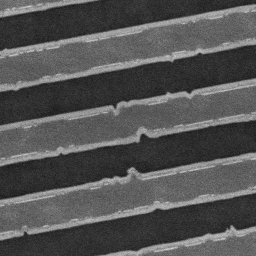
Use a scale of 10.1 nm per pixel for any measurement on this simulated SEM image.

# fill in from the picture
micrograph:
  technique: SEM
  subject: one or a few lines or trenches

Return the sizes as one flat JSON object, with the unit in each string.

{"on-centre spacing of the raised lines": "738 nanometres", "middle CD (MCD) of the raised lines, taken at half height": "357 nm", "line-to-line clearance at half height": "384 nm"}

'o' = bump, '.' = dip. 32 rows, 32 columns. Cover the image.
ooooooo.........................
oo..........................oooo
.......................ooooooooo
.................ooooooooooooooo
............oooooooooooooooooooo
.......ooooooooooooooooooooooo..
.oooooooooooooooooooooooo.......
ooooooooooooooooooo.............
oooooooooooooo..................
ooooooooo.......................
oooo..........................oo
.........................ooooooo
...................ooooooooooooo
...............ooooooooooooooooo
........oooooooooooooooooooooooo
...ooooooooooooooooooooooo......
ooooooooooooooooooooo...........
oooooooooooooooo................
oooooooooo......................
ooooo..........................o
..........................oooooo
................o....ooooooooooo
..............oooooooooooooooooo
..........oooooooooooooooooooooo
....oooooooooooooooooooooooo....
ooooooooooooooooooooooo.........
ooooooooooooooooo...............
oooooooooooo....................
oooooo..........................
o...........................oooo
......................oooooooooo
..................oooooooooooooo